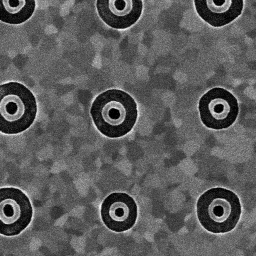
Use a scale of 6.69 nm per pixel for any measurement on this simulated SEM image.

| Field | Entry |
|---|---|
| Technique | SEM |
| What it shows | ring-shaped grooves with a dot in the middle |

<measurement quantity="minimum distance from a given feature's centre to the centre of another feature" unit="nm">663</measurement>